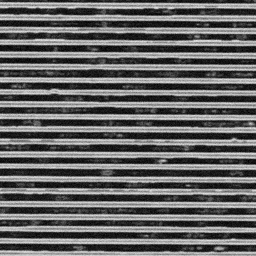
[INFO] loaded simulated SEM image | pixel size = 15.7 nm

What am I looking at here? parallel lines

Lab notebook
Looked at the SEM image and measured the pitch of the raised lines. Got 195 nm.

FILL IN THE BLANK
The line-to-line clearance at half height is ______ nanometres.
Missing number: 139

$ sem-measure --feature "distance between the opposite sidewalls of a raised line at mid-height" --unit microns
0.0628